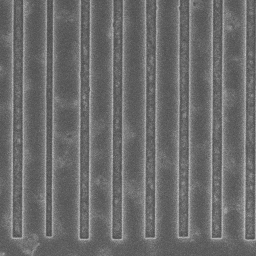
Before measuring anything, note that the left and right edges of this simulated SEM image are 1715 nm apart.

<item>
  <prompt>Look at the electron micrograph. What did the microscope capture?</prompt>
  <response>parallel lines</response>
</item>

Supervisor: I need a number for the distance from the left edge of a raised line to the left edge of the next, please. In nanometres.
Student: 223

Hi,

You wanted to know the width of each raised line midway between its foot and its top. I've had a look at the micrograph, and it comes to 157 nanometres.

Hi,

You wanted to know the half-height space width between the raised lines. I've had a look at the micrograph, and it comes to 66.2 nanometers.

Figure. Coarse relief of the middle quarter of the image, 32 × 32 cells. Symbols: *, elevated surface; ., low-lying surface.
****...*****...*****...******..*
****...*****...*****...******..*
****...*****...*****...******..*
****...*****...*****...******..*
****...*****...*****...******..*
****...*****...*****...******..*
****...*****...*****...******..*
****...*****...*****...******..*
****...*****...*****...******..*
****...*****...*****...******..*
****...*****...*****...******..*
****...*****...*****...******..*
****...*****...*****...******..*
****...*****...*****...******..*
****..******...*****...******..*
****..******...*****...******..*
****..******...*****...******..*
****..******...*****...******..*
****..******...*****...******..*
****..******...*****...******..*
****..******...*****...******..*
****..******...*****...******..*
****..******...*****...******..*
****..******...*****...******..*
****..******...*****...******..*
****..******...*****...******..*
****..******...*****...******..*
****..******...*****...*****...*
****..******...*****...*****...*
****..******...*****...*****...*
****..******...*****...*****...*
****..******...*****...*****...*